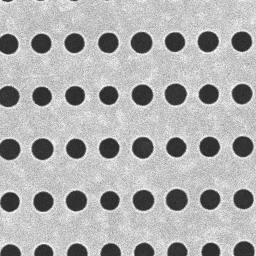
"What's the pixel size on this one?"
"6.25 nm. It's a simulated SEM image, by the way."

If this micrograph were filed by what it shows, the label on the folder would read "a regular array of holes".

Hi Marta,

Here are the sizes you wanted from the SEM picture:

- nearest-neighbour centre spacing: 208 nm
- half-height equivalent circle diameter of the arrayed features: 129 nanometers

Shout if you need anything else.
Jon